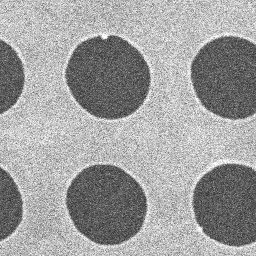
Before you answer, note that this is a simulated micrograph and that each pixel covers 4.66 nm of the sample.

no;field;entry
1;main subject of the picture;holes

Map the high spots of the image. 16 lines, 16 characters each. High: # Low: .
################
################
#####...#####...
.###.....###....
..##.....###....
.###.....###....
.####....####...
################
################
################
#####...#####...
.###.....###....
.###.....###....
.###.....###....
.####....####...
################